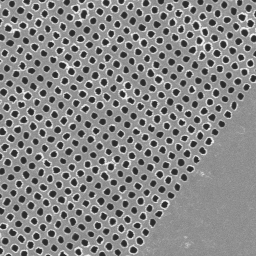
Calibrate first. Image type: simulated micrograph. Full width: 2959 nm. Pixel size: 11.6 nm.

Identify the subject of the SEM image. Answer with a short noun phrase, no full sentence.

a regular array of holes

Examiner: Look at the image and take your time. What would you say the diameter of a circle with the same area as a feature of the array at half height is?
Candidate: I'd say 70.2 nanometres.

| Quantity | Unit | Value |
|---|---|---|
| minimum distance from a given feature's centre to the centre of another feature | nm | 121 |